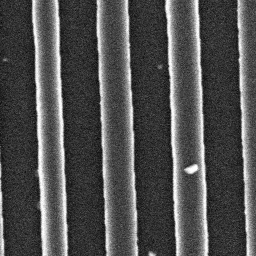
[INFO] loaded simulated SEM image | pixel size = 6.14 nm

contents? lines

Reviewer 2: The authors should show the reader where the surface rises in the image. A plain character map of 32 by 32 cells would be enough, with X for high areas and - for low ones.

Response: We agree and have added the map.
----XXX-----XXXX-----XXXX-----XX
----XXX-----XXXX-----XXXX-----XX
----XXX-----XXXX-----XXXX-----XX
----XXX-----XXXX-----XXXX-----XX
----XXX-----XXXX-----XXXX-----XX
----XXX-----XXXX-----XXXX-----XX
----XXX-----XXXX-----XXXX-----XX
----XXX-----XXXX-----XXXX-----XX
----XXX-----XXXX-----XXXX-----XX
----XXX-----XXXX-----XXXX-----XX
-----XX------XXX-----XXXX-----XX
-----XXX-----XXX-----XXXX-----XX
-----XXX-----XXX-----XXXX-----XX
-----XXX-----XXXX----XXXX-----XX
-----XXX-----XXXX----XXXX-----XX
-----XXX-----XXXX----XXXX-----XX
-----XXX-----XXXX----XXXX-----XX
-----XXX-----XXXX-----XXX-----XX
-----XXX-----XXXX-----XXX-----XX
-----XXX-----XXXX-----XXX-----XX
-----XXX-----XXXX-----XXX------X
-----XXX-----XXXX-----XXXX-----X
-----XXX-----XXXX-----XXXX-----X
-----XXX-----XXXX-----XXXX-----X
-----XXX-----XXXX-----XXXX-----X
-----XXX-----XXXX-----XXXX-----X
-----XXX-----XXXX-----XXXX-----X
-----XXX-----XXXX-----XXXX-----X
-----XXX-----XXXX-----XXXX-----X
-----XXX-----XXXX-----XXXX-----X
-----XXX-----XXXX-----XXXX-----X
-----XXX-----XXXX-----XXXX-----X